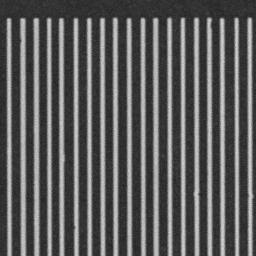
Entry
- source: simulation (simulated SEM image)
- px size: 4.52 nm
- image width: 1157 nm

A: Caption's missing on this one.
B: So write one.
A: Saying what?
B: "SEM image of parallel lines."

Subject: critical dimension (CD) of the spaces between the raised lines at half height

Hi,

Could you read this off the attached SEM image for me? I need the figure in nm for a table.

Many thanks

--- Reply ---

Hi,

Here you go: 43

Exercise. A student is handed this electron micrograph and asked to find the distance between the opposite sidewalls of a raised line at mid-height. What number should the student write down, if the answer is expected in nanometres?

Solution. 17.5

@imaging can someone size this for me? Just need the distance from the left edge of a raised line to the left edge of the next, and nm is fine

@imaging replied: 60.5